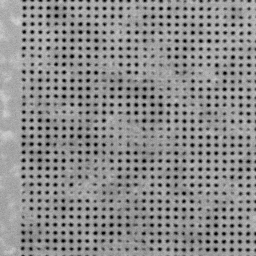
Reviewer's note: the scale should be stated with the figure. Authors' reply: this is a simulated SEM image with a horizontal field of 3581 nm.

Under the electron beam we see a regular array of holes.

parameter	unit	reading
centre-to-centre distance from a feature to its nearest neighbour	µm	0.109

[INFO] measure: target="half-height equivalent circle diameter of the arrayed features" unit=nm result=59.1